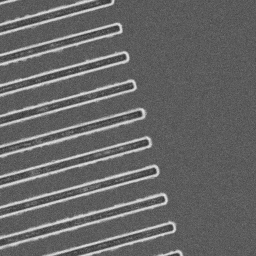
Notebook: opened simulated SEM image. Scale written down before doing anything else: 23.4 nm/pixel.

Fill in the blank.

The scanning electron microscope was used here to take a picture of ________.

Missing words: parallel lines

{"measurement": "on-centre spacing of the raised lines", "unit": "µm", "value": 0.689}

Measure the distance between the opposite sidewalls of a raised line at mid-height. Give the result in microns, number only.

0.483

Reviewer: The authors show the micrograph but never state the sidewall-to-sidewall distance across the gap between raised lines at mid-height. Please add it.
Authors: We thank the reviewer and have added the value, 220 nanometers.